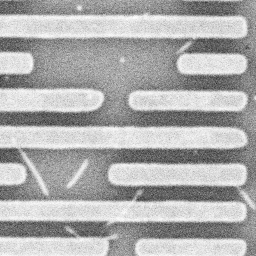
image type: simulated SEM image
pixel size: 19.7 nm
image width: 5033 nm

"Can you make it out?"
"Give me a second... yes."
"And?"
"wiring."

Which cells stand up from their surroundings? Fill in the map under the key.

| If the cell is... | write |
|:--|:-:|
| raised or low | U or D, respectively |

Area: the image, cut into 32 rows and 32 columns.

DDDDDDDDDDDDDDDDDDDDDDDDDDDDDDDD
DDDDDDDDDDDDDDDDDDDDDDDDDDDDDDDD
UUUUUUUUUUUUUUUUUUUUUUUUUUUUUUDD
UUUUUUUUUUUUUUUUUUUUUUUUUUUUUUUD
DDUUUUUUUUUUUDDUUUUUUUUUUUUUUUDD
DDDDDDDDDDDDDDDDDDDDDDDDDDDDDDDD
DDDDDDDDDDDDDDDDDDDDDDDDDDDDDDDD
UUUUDDDDDDDDDDDDDDDDDDUUUUUUUUUD
UUUUDDDDDDDDDDDDDDDDDDUUUUUUUUUD
DDDDDDDDDDDDDDDDDDDDDDDDDDDDDDDD
DDDDDDDDDDDDDDDDDDDDDDDDDDDDDDDD
UUUUUUUUUUUUDDDDDDDDDUUUUDUUUDDD
UUUUUUUUUUUUUDDDUUUUUUUUUUUUUUUD
UUUUUUUUUUUUDDDDDUUUUUUUUUUUUUDD
DDDDDDDDDDDDDDDDDDDDDDDDDDDDDDDD
DDDDDDDDDDDDDDDDDDDDDDDDDDDDDDDD
UUUUUUUUUUUUUUUUUUUUUUUUUUUUUUDD
UUUUUUUUUUUUUUUUUUUUUUUUUUUUUUUD
DDDDDDDDDDDDDDDDDDDDDDDDDDDDDDDD
DDDDDDDDDDDDDDDDDDDDDDDDDDDDDDDD
DDDDDDDDDDDDDDDDDDDDDDDDDDDDDDDD
UUUDDDDDDDDDDDUUUUUUUUUUUUUUUUUD
UUUDDDDDDDDDDDUUUUUUUUUUUUUUUUUD
DDDDDDDDDDDDDDDDDDDDDDDDDDDDDDDD
DDDDDDDDDDDDDDDDDDDDDDDDDDDDDDDD
UUUUUUUUUUUUUUUUUUUUUUUUUUUUUUDD
UUUUUUUUUUUUUUUUUUUUUUUUUUUUUUUD
DDDDDDUUUUUUUUUUUUUUUUUUUUUUUUDD
DDDDDDDDDDDDDDDDDDDDDDDDDDDDDDDD
DDDDDDDDDDDDDDDDDDDDDDDDDDDDDDDD
UUUUUUUUUUUUUDDDDUUUUUUUUUUUUUUD
UUUUUUUUUUUUUDDDDUUUUUUUUUUUUUUD